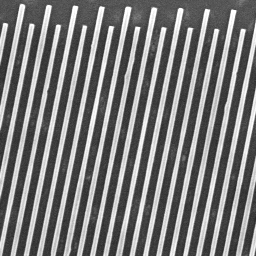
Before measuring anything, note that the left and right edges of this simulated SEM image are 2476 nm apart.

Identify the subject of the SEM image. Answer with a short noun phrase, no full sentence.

parallel lines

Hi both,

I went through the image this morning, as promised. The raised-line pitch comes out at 126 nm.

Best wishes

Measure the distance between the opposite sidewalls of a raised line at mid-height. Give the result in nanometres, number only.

35.6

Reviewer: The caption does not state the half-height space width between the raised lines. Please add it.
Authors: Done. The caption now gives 90.1 nanometers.